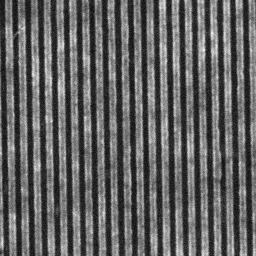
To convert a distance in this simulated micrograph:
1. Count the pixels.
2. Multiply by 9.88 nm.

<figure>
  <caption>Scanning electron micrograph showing parallel lines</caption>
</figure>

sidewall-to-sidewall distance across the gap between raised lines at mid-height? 67.9 nanometres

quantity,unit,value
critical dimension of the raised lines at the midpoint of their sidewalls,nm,59.3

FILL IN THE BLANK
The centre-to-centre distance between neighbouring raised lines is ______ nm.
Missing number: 126